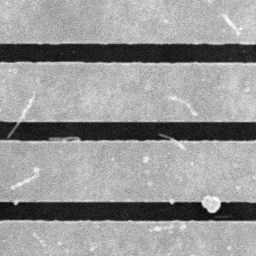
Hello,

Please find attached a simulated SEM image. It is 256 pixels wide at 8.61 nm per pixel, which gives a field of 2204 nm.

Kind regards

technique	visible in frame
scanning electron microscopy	lines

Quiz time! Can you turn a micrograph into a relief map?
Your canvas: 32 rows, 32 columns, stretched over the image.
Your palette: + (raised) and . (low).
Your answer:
++++++++++++++++++++++++++++++++
++++++++++++++++++++++++++++++++
++++++++++++++++++++++++++++++++
++++++++++++++++++++++++++++++++
++++++++++++++++++++++++++++++++
................................
................................
................................
++++++++++++++++++++++++++++++++
++++++++++++++++++++++++++++++++
++++++++++++++++++++++++++++++++
++++++++++++++++++++++++++++++++
++++++++++++++++++++++++++++++++
++++++++++++++++++++++++++++++++
++++++++++++++++++++++++++++++++
................................
................................
.....................+..........
++++++++++++++++++++++++++++++++
++++++++++++++++++++++++++++++++
++++++++++++++++++++++++++++++++
++++++++++++++++++++++++++++++++
++++++++++++++++++++++++++++++++
++++++++++++++++++++++++++++++++
++++++++++++++++++++++++++++++++
.........................+++....
..........................+.....
................................
++++++++++++++++++++++++++++++++
++++++++++++++++++++++++++++++++
++++++++++++++++++++++++++++++++
++++++++++++++++++++++++++++++++